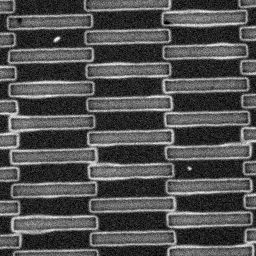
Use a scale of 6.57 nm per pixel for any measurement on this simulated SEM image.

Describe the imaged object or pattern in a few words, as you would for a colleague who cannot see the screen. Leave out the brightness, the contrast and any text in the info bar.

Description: groups of lines, slits or small figures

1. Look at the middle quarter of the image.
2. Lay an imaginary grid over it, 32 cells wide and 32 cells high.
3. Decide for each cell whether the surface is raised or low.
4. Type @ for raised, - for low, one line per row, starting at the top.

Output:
@@@@@@--------------------@@@@@@
@@@@@@---------------------@@@@@
@@@@@@--------------------@@@@@@
@@@@@@@@@@@@@@@@@@@@@@@@@@@@@@@@
@@@@@--@@@@@@@@@@@@@@@@@@-------
-------@@@@@@@@@@@@@@@@@@-------
-------@@@@@@@@@@@@@@@@@@-------
-------@@@@@@@@@@@@@@@@@@@@@@@@@
@@@@@@@@@@@@@@@@-----------@@@@@
@@@@@@---------------------@@@@@
@@@@@@---------------------@@@@@
@@@@@@@------@@@@@@@@@@@@@@@@@@@
@@@@@@@@@@@@@@@@@@@@@@@@@@------
--------@@@@@@@@@@@@@@@@@-------
--------@@@@@@@@@@@@@@@@@-------
-------@@@@@@@@@@@@@@@@@@@@--@@@
@@@@@@@@@@@@@@@@@@@@@@@@@@@@@@@@
@@@@@@---------------------@@@@@
@@@@@@---------------------@@@@@
@@@@@@---------------------@@@@@
@@@@@@@@@@@@@@@@@@@@@@@@@@@@@@@@
@@@@----@@@@@@@@@@@@@@@@@@------
--------@@@@@@@@@@@@@@@@@@------
--------@@@@@@@@@@@@@@@@@@------
@@@@@@@@@@@@@@@@@@@@@@@@@@@@@@@@
@@@@@@@--------------------@@@@@
@@@@@@---------------------@@@@@
@@@@@@---------------------@@@@@
@@@@@@@---------@@@@@@@@@@@@@@@@
@@@@@@@@@@@@@@@@@@@@@@@@@@------
--------@@@@@@@@@@@@@@@@@@------
--------@@@@@@@@@@@@@@@@@@------